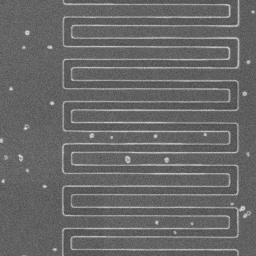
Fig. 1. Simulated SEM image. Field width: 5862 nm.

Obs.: groups of lines, slits or small figures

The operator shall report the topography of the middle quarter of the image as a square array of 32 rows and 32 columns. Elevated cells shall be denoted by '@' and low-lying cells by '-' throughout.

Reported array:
--------------------------------
--@@@@@@@@@@@@@@@@@@@@@@@@@@@@@@
--@@@@@@@@@@@@@@@@@@@@@@@@@@@@@@
--@@@@@@@@@@@@@@@@@@@@@@@@@@@@@@
--------------------------------
--------------------------------
@@@@@@@@@@@@@@@@@@@@@@@@@@@@@@@@
@@@@@@@@@@@@@@@@@@@@@@@@@@@@@@@@
@@@@@@@@@@@@@@@@@@@@@@@@@@@@@@@@
--------------------------------
--------------------------------
--------------------------------
--@@@@@@@@@@@@@@@@@@@@@@@@@@@@@@
--@@@@@@@@@@@@@@@@@@@@@@@@@@@@@@
--@@@@@@@@@@@@@@@@@@@@@@@@@@@@@@
--------------------------------
--------------------------------
@@@@@@@@@@@@@@@@@@@@@@@@@@@@@@@@
@@@@@@@@@@@@@@@@@@@@@@@@@@@@@@@@
@@@@@@@@@@@@@@@@@@@@@@@@@@@@@@@@
--------------------------------
--------------------------------
--@@@@@@@@@@@@@@@@@@@@@@@@@@@@@@
--@@@@@@@@@@@@@@@@@@@@@@@@@@@@@@
--@@@@@@@@@@@@@@@@@@@@@@@@@@@@@@
--------------------------------
--------------------------------
@@@@@@@@@@@@@@@@@---------------
@@@@@@@@@@@@@@@@@@@@@@@@@@@@@@@@
@@@@@@@@@@@@@@@@@@@@@@@@@@@@@@@@
--------------------------------
--------------------------------